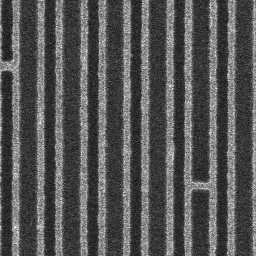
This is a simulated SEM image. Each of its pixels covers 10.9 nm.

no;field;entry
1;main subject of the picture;parallel lines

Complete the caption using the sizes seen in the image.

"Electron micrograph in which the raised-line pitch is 0.234 µm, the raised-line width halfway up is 92.3 nanometers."